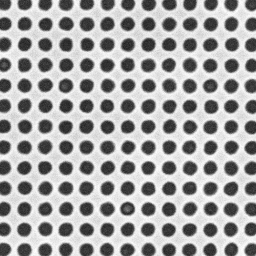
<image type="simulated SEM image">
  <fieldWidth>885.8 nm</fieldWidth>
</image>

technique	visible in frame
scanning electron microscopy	a regular array of holes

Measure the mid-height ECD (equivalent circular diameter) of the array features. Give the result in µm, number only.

0.0485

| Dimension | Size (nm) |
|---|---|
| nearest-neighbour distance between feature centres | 70.2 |